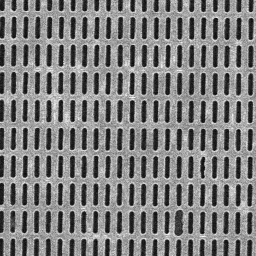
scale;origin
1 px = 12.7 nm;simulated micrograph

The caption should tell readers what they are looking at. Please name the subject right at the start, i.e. a regular array of holes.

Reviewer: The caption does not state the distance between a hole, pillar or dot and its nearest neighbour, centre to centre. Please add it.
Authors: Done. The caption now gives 0.15 um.